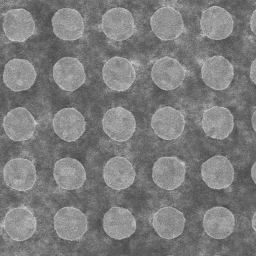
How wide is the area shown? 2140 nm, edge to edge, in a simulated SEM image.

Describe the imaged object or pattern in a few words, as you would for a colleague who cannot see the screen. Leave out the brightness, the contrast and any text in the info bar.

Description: a regular array of raised bodies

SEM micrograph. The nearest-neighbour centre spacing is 0.412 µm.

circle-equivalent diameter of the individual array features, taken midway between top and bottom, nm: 274